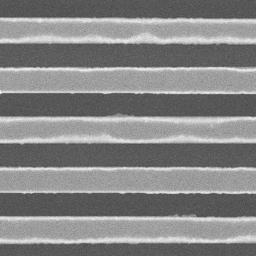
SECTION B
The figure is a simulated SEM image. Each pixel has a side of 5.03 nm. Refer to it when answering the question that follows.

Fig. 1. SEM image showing lines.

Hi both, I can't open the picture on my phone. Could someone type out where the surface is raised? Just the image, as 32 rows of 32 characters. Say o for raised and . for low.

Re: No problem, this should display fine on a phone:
................................
................................
oooooooooooooooooooooooooooooooo
oooooooooooooooooooooooooooooooo
oooooooooooooooooooooooooooooooo
................................
................................
................................
....o..o......oooo..ooooooooo...
oooooooooooooooooooooooooooooooo
oooooooooooooooooooooooooooooooo
oooooooooooooooooooooooooooooooo
................................
................................
................................
oooooooooooooooooooooooooooooooo
oooooooooooooooooooooooooooooooo
oooooooooooooooooooooooooooooooo
................................
................................
................................
oooooooooooooooooooooooooooooooo
oooooooooooooooooooooooooooooooo
oooooooooooooooooooooooooooooooo
................................
................................
................................
oooooooooooooooooooooooooooooooo
oooooooooooooooooooooooooooooooo
oooooooooooooooooooooooooooooooo
................................
................................